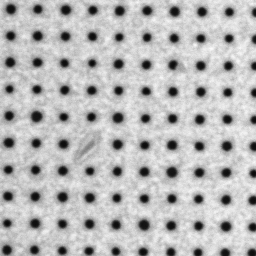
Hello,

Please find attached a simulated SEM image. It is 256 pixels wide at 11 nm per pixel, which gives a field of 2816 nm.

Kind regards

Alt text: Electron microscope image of a regular array of holes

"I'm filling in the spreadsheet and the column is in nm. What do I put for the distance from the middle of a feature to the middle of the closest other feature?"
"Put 290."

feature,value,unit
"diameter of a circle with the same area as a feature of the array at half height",107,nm